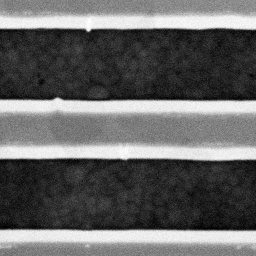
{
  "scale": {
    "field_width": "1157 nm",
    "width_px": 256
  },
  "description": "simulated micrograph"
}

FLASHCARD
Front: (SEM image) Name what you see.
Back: one or a few lines or trenches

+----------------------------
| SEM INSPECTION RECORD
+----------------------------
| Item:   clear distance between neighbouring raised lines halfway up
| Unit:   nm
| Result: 369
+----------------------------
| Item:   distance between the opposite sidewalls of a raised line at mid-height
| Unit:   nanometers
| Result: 217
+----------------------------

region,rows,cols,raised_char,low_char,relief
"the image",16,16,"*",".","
****************
........*.......
................
................
................
................
...*............
****************
****************
****************
................
................
................
................
................
****************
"